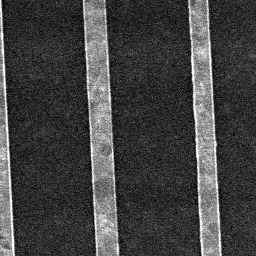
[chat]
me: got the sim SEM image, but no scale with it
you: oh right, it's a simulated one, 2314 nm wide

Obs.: one or a few lines or trenches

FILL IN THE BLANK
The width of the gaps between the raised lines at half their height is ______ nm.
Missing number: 749